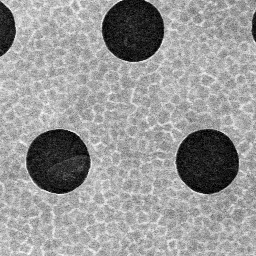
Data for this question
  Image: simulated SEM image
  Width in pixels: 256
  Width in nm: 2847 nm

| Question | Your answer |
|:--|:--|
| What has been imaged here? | holes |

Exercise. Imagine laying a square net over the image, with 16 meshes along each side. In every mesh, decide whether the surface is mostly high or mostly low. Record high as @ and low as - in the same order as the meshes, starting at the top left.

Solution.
@@@@@@@---@@@@@@
-@@@@@----@@@@@@
-@@@@@@---@@@@@@
@@@@@@@--@@@@@@@
@@@@@@@@@@@@@@@@
@@@@@@@@@@@@@@@@
@@@@@@@@@@@@@@@@
@@@@@@@@@@@@@@@@
@@---@@@@@@@--@@
@@----@@@@@----@
@@----@@@@@----@
@@---@@@@@@@--@@
@@@@@@@@@@@@@@@@
@@@@@@@@@@@@@@@@
@@@@@@@@@@@@@@@@
@@@@@@@@@@@@@@@@